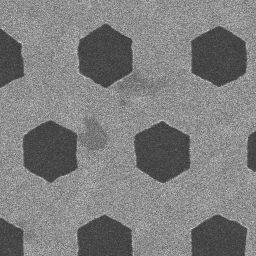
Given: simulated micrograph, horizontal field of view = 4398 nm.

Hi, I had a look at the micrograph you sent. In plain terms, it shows holes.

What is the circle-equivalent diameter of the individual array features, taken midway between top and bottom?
992 nanometers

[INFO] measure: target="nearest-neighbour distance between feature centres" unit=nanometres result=1900